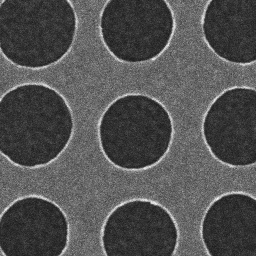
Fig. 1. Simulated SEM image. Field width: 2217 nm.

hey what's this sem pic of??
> holes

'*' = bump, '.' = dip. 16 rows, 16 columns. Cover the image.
....***....**...
.....*.....**...
.....**....**...
....***...****..
****************
*..*************
....***...***...
....**.....**...
....**.....**...
....***...***...
********.*******
****************
*..***********..
....***....**...
....***....**...
....***....**...